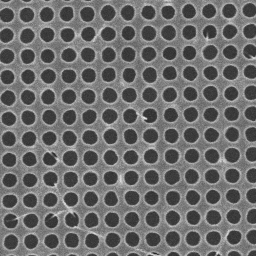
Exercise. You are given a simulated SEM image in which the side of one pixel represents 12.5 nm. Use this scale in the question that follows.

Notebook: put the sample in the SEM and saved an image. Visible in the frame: a regular array of holes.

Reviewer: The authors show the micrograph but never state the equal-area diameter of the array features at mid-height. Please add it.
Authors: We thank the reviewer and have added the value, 0.181 µm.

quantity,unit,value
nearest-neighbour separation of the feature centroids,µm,0.249